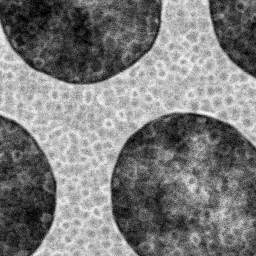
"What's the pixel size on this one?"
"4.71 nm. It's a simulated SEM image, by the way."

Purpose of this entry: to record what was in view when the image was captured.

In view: holes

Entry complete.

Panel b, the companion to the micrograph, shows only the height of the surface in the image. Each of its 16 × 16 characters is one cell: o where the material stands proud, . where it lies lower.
..........ooo...
..........ooo...
..........oooo..
o........ooooo..
oo......ooooooo.
oooooooooooooooo
oooooooooooooooo
.ooooooooo....oo
..oooooo.......o
...ooooo........
...oooo.........
....ooo.........
....ooo.........
...oooo.........
...ooooo........
..oooooo........